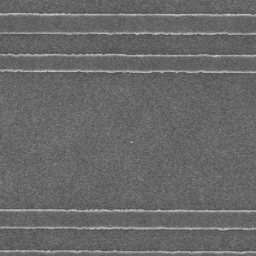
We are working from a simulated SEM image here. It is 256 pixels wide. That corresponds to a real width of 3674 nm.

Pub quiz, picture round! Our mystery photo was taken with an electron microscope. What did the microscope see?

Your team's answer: lines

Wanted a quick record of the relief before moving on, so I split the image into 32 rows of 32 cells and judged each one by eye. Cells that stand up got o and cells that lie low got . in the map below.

................................
................................
oooooooooooooooooooooooooooooooo
oooooooooooooooooooooooooooooooo
................................
................................
................................
oooooooooooooooooooooooooooooooo
oooooooooooooooooooooooooooooooo
................................
................................
................................
................................
................................
................................
................................
................................
................................
................................
................................
................................
................................
................................
................................
................................
................................
oooooooooooooooooooooooooooooooo
oooooooooooooooooooooooooooooooo
...o.oo..ooooooooooooooooooooooo
................................
................................
oooooooooooooooooooooooooooooooo